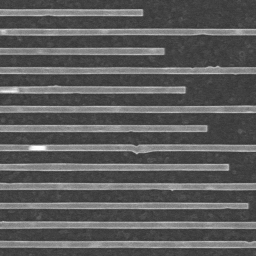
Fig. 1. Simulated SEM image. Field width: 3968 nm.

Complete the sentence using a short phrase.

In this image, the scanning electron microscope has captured parallel lines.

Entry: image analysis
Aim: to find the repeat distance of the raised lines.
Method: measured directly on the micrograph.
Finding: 299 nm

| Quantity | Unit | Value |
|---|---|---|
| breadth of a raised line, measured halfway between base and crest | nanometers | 96.9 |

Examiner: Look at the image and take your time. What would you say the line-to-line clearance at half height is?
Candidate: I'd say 0.203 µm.